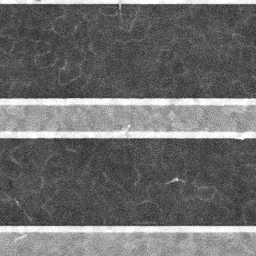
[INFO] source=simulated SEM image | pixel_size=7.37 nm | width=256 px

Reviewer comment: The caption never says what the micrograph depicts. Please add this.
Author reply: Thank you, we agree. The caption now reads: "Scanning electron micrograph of one or a few lines or trenches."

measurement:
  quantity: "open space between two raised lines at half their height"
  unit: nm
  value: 710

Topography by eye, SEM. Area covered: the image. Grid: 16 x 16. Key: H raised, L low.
LLLLLLLLLLLLLLLL
LLLLLLLLLLLLLLLL
LLLLLLLLLLLLLLLL
LLLLLLLLLLLLLLLL
LLLLLLLLLLLLLLLL
LLLLLLLLLLLLLLLL
HHHHHHHHHHHHHHHH
HHHHHHHHHHHHHHHH
LLLLLLLLLLLLLLLL
LLLLLLLLLLLLLLLL
LLLLLLLLLLLLLLLL
LLLLLLLLLLLLLLLL
LLLLLLLLLLLLLLLL
LLLLLLLLLLLLLLLL
HHHHHHHHHHHHHHHH
HHHHHHHHHHHHHHHH